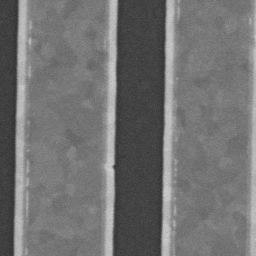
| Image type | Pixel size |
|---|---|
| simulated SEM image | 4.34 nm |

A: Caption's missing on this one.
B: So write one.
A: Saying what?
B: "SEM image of one or a few lines or trenches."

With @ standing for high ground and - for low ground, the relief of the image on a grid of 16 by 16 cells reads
-@@@@@@----@@@@@
-@@@@@@----@@@@@
-@@@@@@----@@@@@
-@@@@@@----@@@@@
-@@@@@@----@@@@@
-@@@@@@----@@@@@
-@@@@@@----@@@@@
-@@@@@@----@@@@@
-@@@@@@----@@@@@
-@@@@@@---@@@@@@
-@@@@@@---@@@@@@
-@@@@@@---@@@@@@
-@@@@@@---@@@@@@
-@@@@@@---@@@@@@
-@@@@@@---@@@@@@
-@@@@@@---@@@@@@